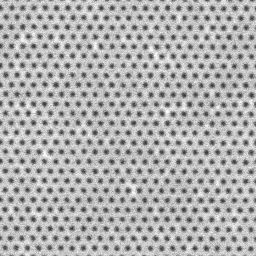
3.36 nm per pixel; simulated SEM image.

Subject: a regular array of holes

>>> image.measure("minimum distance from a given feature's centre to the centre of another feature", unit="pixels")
10.7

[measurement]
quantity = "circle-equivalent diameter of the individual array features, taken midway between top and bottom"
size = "5.18 pixels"